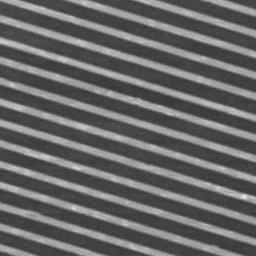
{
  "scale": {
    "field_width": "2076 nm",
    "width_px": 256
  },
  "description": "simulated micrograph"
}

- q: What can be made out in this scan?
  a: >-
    parallel lines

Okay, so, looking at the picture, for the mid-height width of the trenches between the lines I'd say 0.114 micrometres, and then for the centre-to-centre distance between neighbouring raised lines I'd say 162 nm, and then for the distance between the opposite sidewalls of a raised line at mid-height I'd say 0.0427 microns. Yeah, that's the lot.